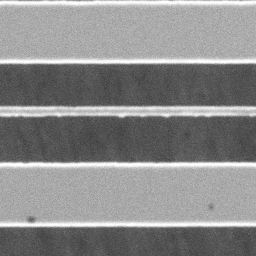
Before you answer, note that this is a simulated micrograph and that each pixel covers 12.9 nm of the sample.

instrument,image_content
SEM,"lines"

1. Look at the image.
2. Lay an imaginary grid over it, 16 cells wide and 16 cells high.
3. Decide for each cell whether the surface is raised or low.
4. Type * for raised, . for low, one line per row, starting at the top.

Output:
****************
****************
****************
****************
................
................
................
................
................
................
****************
****************
****************
****************
................
................